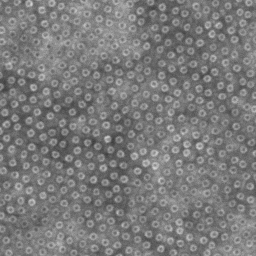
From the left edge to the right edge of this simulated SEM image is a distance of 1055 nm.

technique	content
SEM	a regular array of raised bodies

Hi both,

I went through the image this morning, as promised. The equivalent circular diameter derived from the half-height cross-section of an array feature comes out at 24.6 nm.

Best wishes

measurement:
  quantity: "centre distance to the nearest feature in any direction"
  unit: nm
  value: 43.8